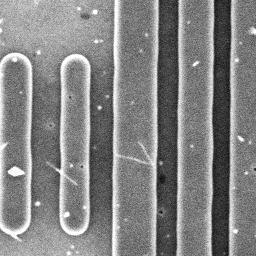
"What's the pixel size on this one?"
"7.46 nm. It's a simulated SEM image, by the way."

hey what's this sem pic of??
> groups of lines, slits or small figures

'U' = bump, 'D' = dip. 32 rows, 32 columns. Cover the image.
DDDDDDDDDDDDDDUUUUUUDDUUUUUDDUUU
DDDDDDDDDDDDDDUUUUUUDDUUUUUDDUUU
DDDDDDDDDDDDDDUUUUUUDDUUUUUDDUUU
DDDDDDDDDDDDDDUUUUUUDDUUUUUDDUUU
DDDDDDDDDDDDDDUUUUUUDDUUUUUDDUUU
DDDDDDDDDDDDDDUUUUUUDDUUUUUDDUUU
DDDDDDDDDDDDDDUUUUUUDDUUUUUDDUUU
UUUDDDDDUUUDDDUUUUUUDDUUUUUDDUUU
UUUUDDDDUUUDDDUUUUUUDDUUUUUDDUUU
UUUUDDDDUUUDDDUUUUUUDDUUUUUDDUUU
UUUUDDDDUUUDDDUUUUUUDDUUUUUDDUUU
UUUUDDDDUUUDDDUUUUUUDDUUUUUDDUUU
UUUUDDDDUUUDDDUUUUUUDDUUUUUDDUUU
UUUUDDDDUUUDDDUUUUUUDDUUUUDDDUUU
UUUUDDDDUUUDDDUUUUUUDDUUUUDDDUUU
UUUUDDDDUUUDDDUUUUUUDDUUUUDDDUUU
UUUUDDDDUUUDDDUUUUUUDDUUUUUDDUUU
UUUUDDDDUUUDDDUUUUUUDDUUUUUDDUUU
UUUUDDDDUUUDDDUUUUUUDDUUUUUDDUUU
UUUUDDDDUUUDDDUUUUUUDDUUUUUDDUUU
UUUUDDDDUUUDDDUUUUUDDDUUUUUDDUUU
UUUUDDDDUUUDDDUUUUUDDDUUUUDDDUUU
UUUUDDDDUUUDDDUUUUUDDDUUUUDDDUUU
UUUUDDDDUUUDDDUUUUUDDDUUUUUDDUUU
UUUUDDDDUUUDDDUUUUUDDDUUUUUDDUUU
UUUUDDDDUUUDDDUUUUUDDDUUUUDDDUUU
UUUUDDDDUUUDDDUUUUUDDDUUUUDDDUUU
UUUUDDDDUUUDDDUUUUUDDDUUUUDDDUUU
UUUDDDDDUUUDDDUUUUUDDDUUUUDDDUUU
DDDDDDDDDDDDDDUUUUUDDDUUUUDDDUUU
DDDDDDDDDDDDDDUUUUUDDDUUUUDDDUUU
DDDDDDDDDDDDDDUUUUUDDDUUUUDDDUUU